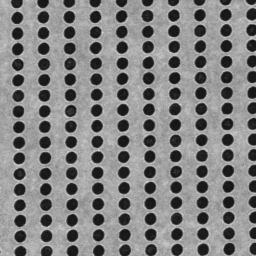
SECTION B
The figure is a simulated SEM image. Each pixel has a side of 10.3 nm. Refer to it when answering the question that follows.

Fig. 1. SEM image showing a regular array of holes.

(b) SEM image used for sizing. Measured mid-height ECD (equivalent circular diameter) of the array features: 127 nanometers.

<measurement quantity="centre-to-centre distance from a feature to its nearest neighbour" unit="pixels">15.5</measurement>